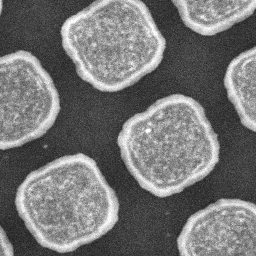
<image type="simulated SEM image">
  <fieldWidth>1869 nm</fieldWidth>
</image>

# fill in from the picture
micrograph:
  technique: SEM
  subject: raised bodies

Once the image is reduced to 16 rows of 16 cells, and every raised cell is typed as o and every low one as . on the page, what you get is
......ooo..ooooo
....oooooo..oo..
....oooooo......
.o...ooooo.....o
ooo..oooo.....oo
ooo...........oo
ooo.......oo...o
ooo.....ooooo..o
oo......ooooo...
........ooooo...
...ooo..ooooo...
.oooooo..ooo....
.oooooo.........
.oooooo.....oooo
..oooo......oooo
o..........ooooo